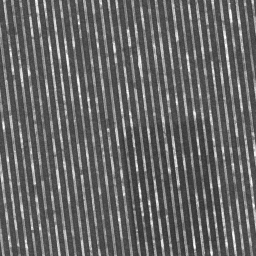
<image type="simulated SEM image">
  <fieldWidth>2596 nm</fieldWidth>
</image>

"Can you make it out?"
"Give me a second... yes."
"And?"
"parallel lines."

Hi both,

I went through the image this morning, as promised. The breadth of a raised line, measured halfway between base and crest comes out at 18.9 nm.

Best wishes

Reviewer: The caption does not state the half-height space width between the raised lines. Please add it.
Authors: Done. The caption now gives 60.4 nm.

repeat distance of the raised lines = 0.0806 µm